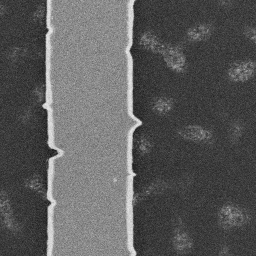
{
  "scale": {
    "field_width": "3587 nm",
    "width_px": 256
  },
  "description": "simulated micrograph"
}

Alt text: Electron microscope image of one or a few lines or trenches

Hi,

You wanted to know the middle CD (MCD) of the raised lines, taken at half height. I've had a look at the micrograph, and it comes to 1130 nm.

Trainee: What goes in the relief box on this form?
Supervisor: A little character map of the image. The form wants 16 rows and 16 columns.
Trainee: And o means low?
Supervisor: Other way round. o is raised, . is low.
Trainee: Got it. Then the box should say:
...ooooo........
...ooooo........
...ooooo........
...ooooo........
...ooooo........
...ooooo........
...ooooo........
...ooooo........
...ooooo........
...ooooo........
...ooooo........
...ooooo........
...ooooo........
...ooooo........
...ooooo........
...ooooo........